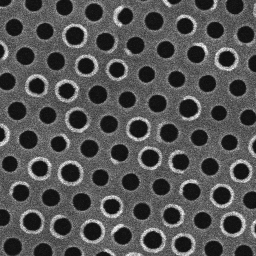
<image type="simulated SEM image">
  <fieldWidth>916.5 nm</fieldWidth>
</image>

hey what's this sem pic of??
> a regular array of holes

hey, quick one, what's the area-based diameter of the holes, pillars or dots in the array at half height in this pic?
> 61.2 nanometres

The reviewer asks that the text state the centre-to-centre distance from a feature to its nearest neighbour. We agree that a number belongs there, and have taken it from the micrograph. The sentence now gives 109 nm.